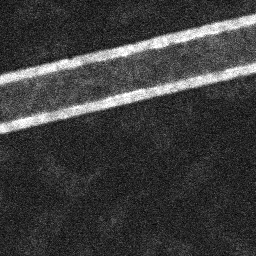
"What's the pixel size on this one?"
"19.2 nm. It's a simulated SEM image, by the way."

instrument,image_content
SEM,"one or a few lines or trenches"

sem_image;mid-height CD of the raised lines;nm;932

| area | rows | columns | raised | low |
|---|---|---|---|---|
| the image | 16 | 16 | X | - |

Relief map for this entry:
----------------
--------------XX
----------XXXXXX
------XXXXXXXXXX
--XXXXXXXXXXXXX-
XXXXXXXXXXX-----
XXXXXXX---------
XX--------------
----------------
----------------
----------------
----------------
----------------
----------------
----------------
----------------